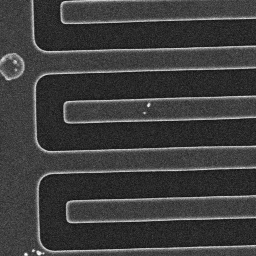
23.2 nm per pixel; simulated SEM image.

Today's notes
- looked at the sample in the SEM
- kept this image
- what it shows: groups of lines, slits or small figures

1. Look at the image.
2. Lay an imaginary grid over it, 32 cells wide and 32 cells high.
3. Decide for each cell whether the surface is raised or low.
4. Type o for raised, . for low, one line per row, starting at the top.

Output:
oooo....oooooooooooooooooooooooo
oooo....oooooooooooooooooooooooo
oooo....oooooooooooo............
oooo............................
oooo............................
ooooo...........................
oooooooooooooooooooooooooooooooo
oooooooooooooooooooooooooooooooo
oooooooooooooooooooooooooooooo..
ooooo...........................
ooooo...........................
oooo............................
oooo.............ooooooooooooooo
oooo....oooooooooooooooooooooooo
oooo....oooooooooooooooooooooooo
oooo............................
ooooo...........................
ooooo...........................
ooooo...................oooooooo
oooooooooooooooooooooooooooooooo
oooooooooooooooooooooooooooooooo
oooooooooooooo..................
ooooo...........................
ooooo...........................
ooooo..........................o
ooooo...oooooooooooooooooooooooo
ooooo...oooooooooooooooooooooooo
ooooo...oooooooooooooo..........
ooooo...........................
ooooo...........................
ooooo...........................
oooooooooooooooooooooooooooooooo